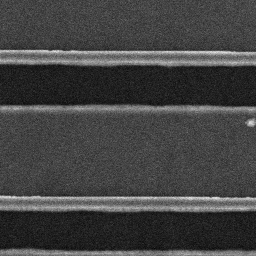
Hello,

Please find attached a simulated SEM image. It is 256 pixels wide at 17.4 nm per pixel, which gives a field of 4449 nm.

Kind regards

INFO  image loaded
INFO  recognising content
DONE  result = lines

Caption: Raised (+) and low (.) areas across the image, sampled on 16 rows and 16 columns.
++++++++++++++++
++++++++++++++++
++++++++++++++++
++++++++++++++++
................
................
................
++++++++++++++++
++++++++++++++++
++++++++++++++++
++++++++++++++++
++++++++++++++++
++++++++++++++++
................
................
................